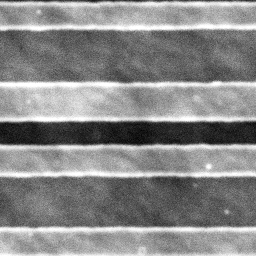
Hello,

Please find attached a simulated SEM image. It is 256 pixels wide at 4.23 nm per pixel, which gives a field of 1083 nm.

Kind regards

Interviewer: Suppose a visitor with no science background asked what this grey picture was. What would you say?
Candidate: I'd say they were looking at lines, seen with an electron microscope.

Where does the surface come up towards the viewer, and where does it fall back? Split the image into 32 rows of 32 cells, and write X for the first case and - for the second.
XXXXXXXXXXXXXXXXXXXXXXXXXXXXXXXX
XXXXXXXXXXXXXXXXXXXXXXXXXXXXXXXX
XXXXXXXXXXXXXXXXXXXXXXXXXXXXXXXX
X-XXXX---XX-XXXXXXXXXXXX--------
--------------------------------
--------------------------------
--------------------------------
--------------------------------
--------------------------------
--------------------------------
X---XXXXXXXXXX------XXXXX-XXXXXX
XXXXXXXXXXXXXXXXXXXXXXXXXXXXXXXX
XXXXXXXXXXXXXXXXXXXXXXXXXXXXXXXX
XXXXXXXXXXXXXXXXXXXXXXXXXXXXXXXX
XXXXXXXXXXXXXXXXXXXXXXXXXXXXXXXX
--------------------------------
--------------------------------
--------------------------------
XXXXXXXXXXXXXXXXXXXXXXXXXXXXXXXX
XXXXXXXXXXXXXXXXXXXXXXXXXXXXXXXX
XXXXXXXXXXXXXXXXXXXXXXXXXXXXXXXX
XXXXXXXXXXXXXXXXXXXXXXXXXXXXXXXX
--------------------------------
--------------------------------
--------------------------------
--------------------------------
--------------------------------
--------------------------------
--------------------------------
XXXXXXXXXXXXXXXXXXXXXXXXXXXXXXXX
XXXXXXXXXXXXXXXXXXXXXXXXXXXXXXXX
XXXXXXXXXXXXXXXXXXXXXXXXXXXXXXXX